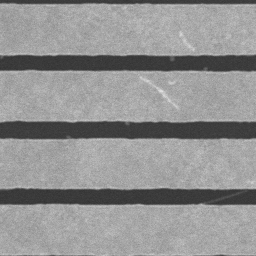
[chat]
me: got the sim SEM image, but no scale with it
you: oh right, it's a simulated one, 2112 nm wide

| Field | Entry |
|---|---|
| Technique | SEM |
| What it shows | lines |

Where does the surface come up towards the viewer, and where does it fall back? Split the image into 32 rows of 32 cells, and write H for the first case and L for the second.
HHLLLLLLLLHHHHLLLHHLLLLLLHLLLLLL
HHHHHHHHHHHHHHHHHHHHHHHHHHHHHHHH
HHHHHHHHHHHHHHHHHHHHHHHHHHHHHHHH
HHHHHHHHHHHHHHHHHHHHHHHHHHHHHHHH
HHHHHHHHHHHHHHHHHHHHHHHHHHHHHHHH
HHHHHHHHHHHHHHHHHHHHHHHHHHHHHHHH
HHHHHHHHHHHHHHHHHHHHHHHHHHHHHHHH
LLLLLLLLLLLLLLLLLLLLLLLLLLLLLLLL
LLLLLLLLLLLLLLLLLLLLLLLLLLLLLLLL
HHHHHHHHHHHHHHHHHHHHHHHHHHHHHHHH
HHHHHHHHHHHHHHHHHHHHHHHHHHHHHHHH
HHHHHHHHHHHHHHHHHHHHHHHHHHHHHHHH
HHHHHHHHHHHHHHHHHHHHHHHHHHHHHHHH
HHHHHHHHHHHHHHHHHHHHHHHHHHHHHHHH
HHHHHHHHHHHHHHHHHHHHHHHHHHHHHHHH
LLLLLLLLLLLLLLLLLLLLLLLLLLLLLLLL
LLLLLLLLLLLLLLLLLLLLLLLLLLLLLLLL
HHHHHHHHHHHHHHHHHHHHHHHHHHHHHHHH
HHHHHHHHHHHHHHHHHHHHHHHHHHHHHHHH
HHHHHHHHHHHHHHHHHHHHHHHHHHHHHHHH
HHHHHHHHHHHHHHHHHHHHHHHHHHHHHHHH
HHHHHHHHHHHHHHHHHHHHHHHHHHHHHHHH
HHHHHHHHHHHHHHHHHHHHHHHHHHHHHHHH
HHLHHHHHHHHHHHHHHHHHLHHHHHHHHHHH
LLLLLLLLLLLLLLLLLLLLLLLLLLLLLLLL
LLLLLLLLLLLLLLLLLLLLLLLLLLLLLLLL
HHHHHHHHHHHHHHHHHHHHHHHHHHHHHHHH
HHHHHHHHHHHHHHHHHHHHHHHHHHHHHHHH
HHHHHHHHHHHHHHHHHHHHHHHHHHHHHHHH
HHHHHHHHHHHHHHHHHHHHHHHHHHHHHHHH
HHHHHHHHHHHHHHHHHHHHHHHHHHHHHHHH
HHHHHHHHHHHHHHHHHHHHHHHHHHHHHHHH